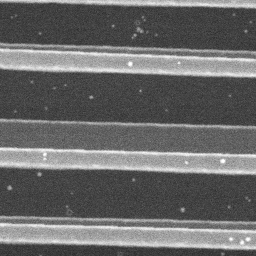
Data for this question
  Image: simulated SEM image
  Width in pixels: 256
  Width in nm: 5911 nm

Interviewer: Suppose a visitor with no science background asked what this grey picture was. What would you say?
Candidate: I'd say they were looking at lines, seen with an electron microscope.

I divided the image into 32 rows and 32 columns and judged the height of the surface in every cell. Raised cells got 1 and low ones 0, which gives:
00000000000000001111111111111111
00000000000000000000000000000000
00000000000000000000000000000000
00000000000000000000000000000000
00000000000000000000000000000000
00000000000000000000000000000000
11111111111111111111111111111000
11111111111111111111111111111111
00011111111111111111111111111111
00000000000000000000000000000000
00000000000000000000000000000000
00000000000000000000000000000000
00000000000000000000000000000000
00000000000000000000000000000000
00000000000000000000000000000000
11111111111111111000000000000000
11111111111111111111111111111111
11111111111111111111111111111111
11111111111111111111111111111111
11111111111111111111111111111111
11111111111111111111111111111111
00000000000000000000000000001111
00000000000000000000000000000000
00000000000000000000000000000000
00000000000000000000000000000000
00000000000000000000000000000000
00000000000000000000000000000000
11111111111111111000000000000000
11111111111111111111111111111111
11111111111111111111111111111111
00000000000011111111111111111111
00000000000000000000000000000000